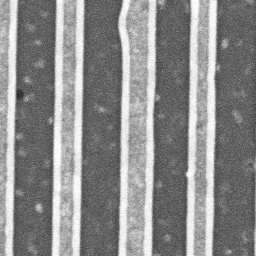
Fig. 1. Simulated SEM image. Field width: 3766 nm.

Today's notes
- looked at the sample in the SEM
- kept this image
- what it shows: one or a few lines or trenches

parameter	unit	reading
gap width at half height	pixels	46.1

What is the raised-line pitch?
0.983 um